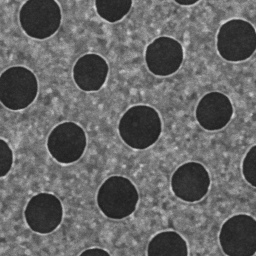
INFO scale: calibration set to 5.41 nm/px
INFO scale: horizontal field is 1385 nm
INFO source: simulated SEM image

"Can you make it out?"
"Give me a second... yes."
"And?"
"a regular array of holes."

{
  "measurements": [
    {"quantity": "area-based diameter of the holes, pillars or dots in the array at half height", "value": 216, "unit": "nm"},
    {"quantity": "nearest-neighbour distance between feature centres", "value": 401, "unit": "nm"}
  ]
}